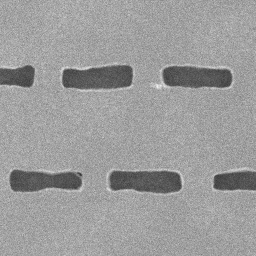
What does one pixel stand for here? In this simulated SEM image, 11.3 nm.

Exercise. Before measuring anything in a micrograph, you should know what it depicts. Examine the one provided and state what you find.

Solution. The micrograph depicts holes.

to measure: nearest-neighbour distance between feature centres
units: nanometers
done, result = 1120